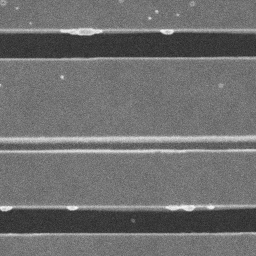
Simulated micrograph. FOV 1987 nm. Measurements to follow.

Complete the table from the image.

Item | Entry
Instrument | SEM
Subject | lines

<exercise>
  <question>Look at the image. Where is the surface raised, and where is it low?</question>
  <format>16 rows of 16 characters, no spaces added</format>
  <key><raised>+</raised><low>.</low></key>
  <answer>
++++++++++++++++
++++++++++++++++
................
................
++++++++++++++++
++++++++++++++++
++++++++++++++++
++++++++++++++++
++++++++++++++++
++++++++++++++++
++++++++++++++++
++++++++++++++++
++++++++++++++++
................
................
++++++++++++++++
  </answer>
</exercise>